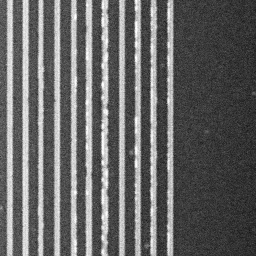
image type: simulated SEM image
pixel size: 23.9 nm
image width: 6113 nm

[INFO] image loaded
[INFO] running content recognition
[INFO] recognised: parallel lines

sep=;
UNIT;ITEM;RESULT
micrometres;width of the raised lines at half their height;0.0925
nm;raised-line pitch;385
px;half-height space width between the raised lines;12.8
